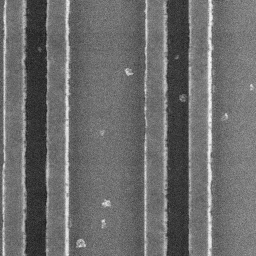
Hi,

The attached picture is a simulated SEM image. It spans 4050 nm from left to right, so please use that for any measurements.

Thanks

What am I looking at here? lines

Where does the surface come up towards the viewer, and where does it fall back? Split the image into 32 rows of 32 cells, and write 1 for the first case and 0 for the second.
01100011000000000011100011000000
01100011000000000011100011000000
01100011000000000011100011000000
01100011000000000011100011000000
01100011000000000011100011000000
01100011000000000011100011000000
01100011000000000011100011000000
01100011000000000011100011000000
01100011000000000011100011000000
01100011000000000011100011000000
01100011000000000011100011000000
01100011000000000011100011000000
01100011000000000011100011000000
01100011000000000011100011000000
01100011000000000011100011000000
01100011000000000011100011000000
01100011000000000011100011000000
01100011000000000011100011000000
01100011000000000011100011000000
01100011000000000011100011000000
11100011000000000011100011000000
11100011000000000011100011000000
11100011000000000011100011000000
11100011000000000011100011000000
11100011000000000011100011000000
11100011000000000011100011000000
11100011000000000011100011000000
11100011000000000011100011000000
11100011000000000011100011000000
11100011000000000011100011000000
11100011000000000011100011000000
11100011000000000011100011000000